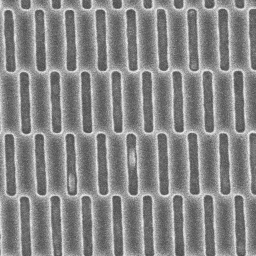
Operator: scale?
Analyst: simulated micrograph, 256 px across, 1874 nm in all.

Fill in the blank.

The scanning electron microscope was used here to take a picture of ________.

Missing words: a regular array of holes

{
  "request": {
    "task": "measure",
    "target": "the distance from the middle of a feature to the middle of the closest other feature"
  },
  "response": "223 nanometers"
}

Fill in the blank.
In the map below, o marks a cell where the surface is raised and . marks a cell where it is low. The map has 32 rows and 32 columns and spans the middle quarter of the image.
...ooooo...ooooo...ooooo..ooooo.
o..oooooo..ooooo..oooooo..oooooo
oooo..oooooo..ooooo...ooooo..ooo
oooo...ooooo..ooooo...ooooo...oo
oooo...ooooo..ooooo...ooooo...oo
oooo...ooooo...oooo...ooooo...oo
oooo...ooooo...oooo...ooooo...oo
oooo...ooooo...oooo...ooooo...oo
oooo...ooooo...oooo...ooooo...oo
oooo...ooooo...ooooo..ooooo...oo
oooo...ooooo...ooooo..ooooo...oo
oooo...ooooo...ooooo..ooooo...oo
oooo...ooooo...ooooo..ooooo...oo
ooooo..ooooo...ooooo..ooooo...oo
ooooo..ooooo...ooooo...oooo...oo
ooooo..ooooo...ooooo...oooo...oo
ooooo..ooooo...ooooo..oooooo..oo
o.oooooo..oooooo..oooooo.oooooo.
...ooooo...oooo...ooooo...ooooo.
...ooooo...oooo...ooooo...ooooo.
...ooooo...oooo...ooooo...ooooo.
...ooooo...oooo...ooooo...ooooo.
o..ooooo...ooooo..ooooo...ooooo.
o..ooooo...ooooo.oooooo...ooooo.
...ooooo...ooooo..ooooo...ooooo.
...ooooo...ooooo..ooooo...ooooo.
o..ooooo...ooooo..ooooo...ooooo.
o..ooooo...ooooo..ooooo...ooooo.
o...oooo...ooooo...ooooo..ooooo.
oo.ooooo...ooooo...ooooo..ooooo.
oo.ooooo...ooooo...ooooo..ooooo.
o..oooooo..ooooo...ooooo..ooooo.